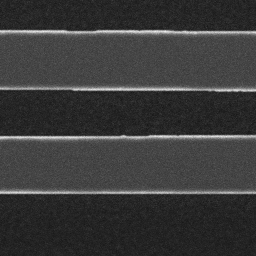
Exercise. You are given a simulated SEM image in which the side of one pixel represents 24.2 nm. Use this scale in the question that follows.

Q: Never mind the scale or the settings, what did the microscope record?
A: lines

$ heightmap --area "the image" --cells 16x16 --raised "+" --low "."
................
................
++++++++++++++++
++++++++++++++++
++++++++++++++++
++++++++++++++++
................
................
.......+.+++++++
++++++++++++++++
++++++++++++++++
++++++++++++++++
................
................
................
................